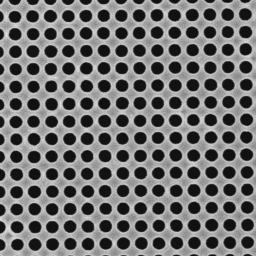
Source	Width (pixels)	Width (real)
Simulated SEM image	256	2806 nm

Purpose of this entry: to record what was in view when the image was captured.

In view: a regular array of holes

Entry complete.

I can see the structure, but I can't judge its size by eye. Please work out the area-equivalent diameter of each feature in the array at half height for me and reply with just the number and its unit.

0.139 um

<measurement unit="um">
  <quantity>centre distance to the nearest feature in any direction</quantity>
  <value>0.19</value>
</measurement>